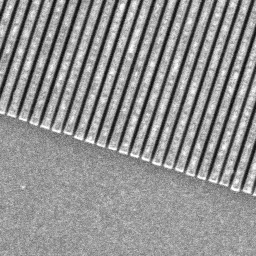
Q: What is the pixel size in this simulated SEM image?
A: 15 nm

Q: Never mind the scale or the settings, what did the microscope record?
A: parallel lines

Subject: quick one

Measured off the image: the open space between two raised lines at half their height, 4.4 pixels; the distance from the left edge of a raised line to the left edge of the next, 175 nm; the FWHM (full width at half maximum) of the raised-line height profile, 120 nanometers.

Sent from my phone